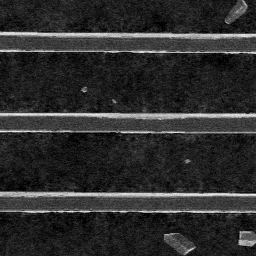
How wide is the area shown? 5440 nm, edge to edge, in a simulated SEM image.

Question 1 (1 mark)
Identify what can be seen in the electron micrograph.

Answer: lines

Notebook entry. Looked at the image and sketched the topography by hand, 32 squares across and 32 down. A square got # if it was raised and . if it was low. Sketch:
................................
................................
................................
................................
######################........##
################################
..............#.################
................................
................................
................................
................................
................................
................................
................................
#################.....##########
################################
...............#################
................................
................................
................................
................................
................................
................................
................................
################################
################################
................................
................................
................................
..............................#.
................................
................................